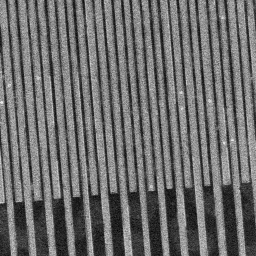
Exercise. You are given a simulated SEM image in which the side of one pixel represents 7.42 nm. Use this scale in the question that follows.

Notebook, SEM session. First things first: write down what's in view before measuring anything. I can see parallel lines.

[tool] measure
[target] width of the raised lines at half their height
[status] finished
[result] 27.7 nanometers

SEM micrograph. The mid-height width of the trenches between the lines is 44.4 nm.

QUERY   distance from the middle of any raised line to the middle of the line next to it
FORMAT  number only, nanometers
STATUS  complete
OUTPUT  70.4